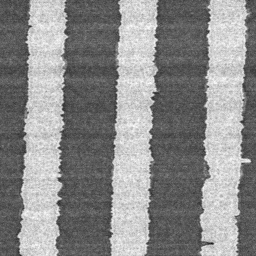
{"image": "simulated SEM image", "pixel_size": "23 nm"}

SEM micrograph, one or a few lines or trenches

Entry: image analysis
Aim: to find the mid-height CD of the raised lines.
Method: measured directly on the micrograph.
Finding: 804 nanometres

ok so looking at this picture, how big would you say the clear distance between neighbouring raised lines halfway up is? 53.5 px